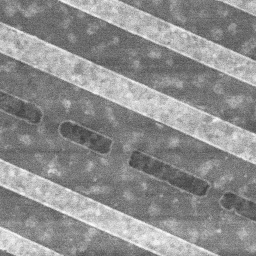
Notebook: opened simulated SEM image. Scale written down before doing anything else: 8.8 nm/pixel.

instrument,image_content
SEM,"one or a few lines or trenches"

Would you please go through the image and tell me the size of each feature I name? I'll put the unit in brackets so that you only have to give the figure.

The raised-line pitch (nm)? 555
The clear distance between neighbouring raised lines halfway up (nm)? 392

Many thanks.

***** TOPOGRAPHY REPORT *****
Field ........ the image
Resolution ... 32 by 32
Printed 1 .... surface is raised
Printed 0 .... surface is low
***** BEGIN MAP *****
00000000011111100000000000000111
00000000000111111100000000000001
00000000000001111111000000000000
11000000000000011111110000000000
11110000000000000011111110000000
11111100000000000000111111100000
11111111000000000000001111111000
00111111111000000000000011111110
00000111111110000000000000011111
00000001111111100000000000000111
00000000011111111000000000000001
10000000000111111111000000000000
11100000000000111111110000000000
11111000000000001111111100000000
00111000000000000011111111100000
00000000110000000000011111111000
00000001111100000000000111111110
00000000111111000000000001111111
00000000000111000000000000011111
00000000000000001110000000000011
10000000000000001111100000000000
11100000000000000011111000000000
11111100000000000000111111000000
01111111000000000000001111000000
00011111110000000000000010001100
00000111111110000000000000001111
00000000111111100000000000000111
00000000001111111000000000000001
00000000000011111110000000000000
11100000000000011111110000000000
11110000000000000111111100000000
01111110000000000001111111000000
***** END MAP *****